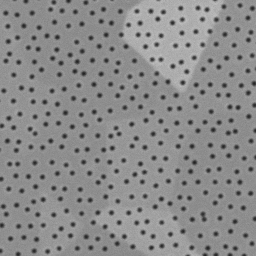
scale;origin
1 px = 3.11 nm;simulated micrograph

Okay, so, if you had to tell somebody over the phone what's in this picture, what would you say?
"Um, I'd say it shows a regular array of holes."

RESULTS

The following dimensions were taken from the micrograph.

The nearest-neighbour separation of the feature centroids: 35.2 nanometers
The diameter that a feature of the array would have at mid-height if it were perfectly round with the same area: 16.8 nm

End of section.